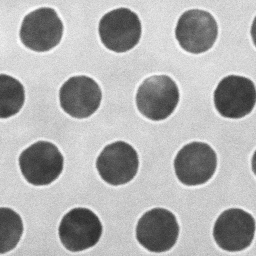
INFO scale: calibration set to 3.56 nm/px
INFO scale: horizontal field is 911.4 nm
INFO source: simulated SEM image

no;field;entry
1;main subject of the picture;a regular array of holes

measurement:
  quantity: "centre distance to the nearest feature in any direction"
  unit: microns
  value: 0.272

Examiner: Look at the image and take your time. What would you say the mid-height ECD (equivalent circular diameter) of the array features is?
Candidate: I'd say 161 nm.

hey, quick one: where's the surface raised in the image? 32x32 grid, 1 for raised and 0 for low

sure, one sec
11111111111111111111111111111111
11110001111110000111111000111111
11100000111100000011110000011111
11000000111100000011110000011110
11000000111100000011110000011110
11100001111110000111110000011111
11110011111111001111111000111111
11111111111111111111111111111111
11111111111111111111111111111111
01111111100111111110011111110011
00011111000011111100001111100000
00011110000001111000001111100000
00011110000001111000001111100000
00011111000011111000001111100000
00111111100111111100011111110001
11111111111111111111111111111111
11111111111111111111111111111111
11111111111111111111111111111111
11100001111110000111111000011111
11000000111100000111110000011110
11000000111100000111110000011110
11100000111100000111110000011111
11100001111110001111110000111111
11111111111111111111111111111111
11111111111111111111111111111111
11111111111111111111111111111111
00111111000011111100011111110001
00011111000001111000001111100000
00011110000001111000001111100000
00011110000001111000001111100000
00111111000011111000001111100001
01111111101111111110011111111111